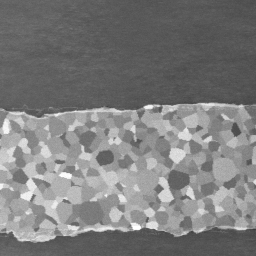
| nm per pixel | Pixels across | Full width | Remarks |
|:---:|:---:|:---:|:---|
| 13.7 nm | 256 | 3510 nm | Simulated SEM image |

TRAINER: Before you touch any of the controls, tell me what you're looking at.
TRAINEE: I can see one or a few lines or trenches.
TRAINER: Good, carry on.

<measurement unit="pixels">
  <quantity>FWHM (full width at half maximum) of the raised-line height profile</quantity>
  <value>122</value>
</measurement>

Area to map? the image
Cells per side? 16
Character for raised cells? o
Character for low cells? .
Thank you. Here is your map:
................
................
................
................
................
................
................
oooooooooooooooo
oooooooooooooooo
oooooooooooooooo
oooooooooooooooo
oooooooooooooooo
oooooooooooooooo
oooooooooooooooo
.oooo.....oo....
................